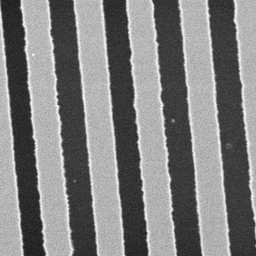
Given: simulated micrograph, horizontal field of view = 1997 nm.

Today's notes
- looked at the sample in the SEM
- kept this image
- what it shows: lines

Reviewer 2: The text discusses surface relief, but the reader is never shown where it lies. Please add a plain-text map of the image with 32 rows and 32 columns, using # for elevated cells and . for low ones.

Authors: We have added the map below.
...###...####...###...####...###
...###...####...###....###...###
...###...####...###....###...###
...###....###...###....###....##
...###....###...###....###....##
#..####...###...####...###....##
#..####...###...####...###....##
#..####...###...####...####...##
#...###...###...####...####...##
#...###...####...###...####...##
#...###...####...###...####...##
#...###...####...###...####...##
#...###...####...###...####...##
#...###...####...###....###...##
#...###....###...###....###...##
#...####...###...###....###....#
##..####...###...####...###....#
##..####...###...####...###....#
##..####...###...####...####...#
##..####...###....###...####...#
##...###...####..####...####...#
##...###...####...###...####...#
##...###...####...###...####...#
##...###....###...###...####...#
##...###....###...###....###...#
##...###....###...###....###...#
##...####...###...###....###....
##...####...###...####...###....
###..####...###...####...###....
###..####...###...####...###....
###..####...###...####...####...
###...###...####...###...####...